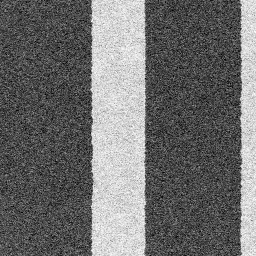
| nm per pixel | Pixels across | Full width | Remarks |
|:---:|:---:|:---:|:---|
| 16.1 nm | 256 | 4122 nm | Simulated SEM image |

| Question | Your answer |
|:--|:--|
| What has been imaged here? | one or a few lines or trenches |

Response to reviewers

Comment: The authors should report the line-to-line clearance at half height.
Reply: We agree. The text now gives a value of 1570 nm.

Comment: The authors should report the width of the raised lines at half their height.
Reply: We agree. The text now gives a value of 0.841 um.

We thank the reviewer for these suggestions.